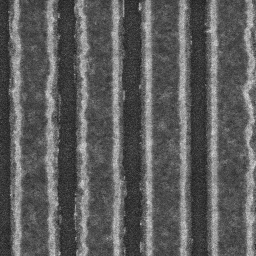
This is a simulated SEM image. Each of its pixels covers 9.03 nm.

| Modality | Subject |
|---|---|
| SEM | one or a few lines or trenches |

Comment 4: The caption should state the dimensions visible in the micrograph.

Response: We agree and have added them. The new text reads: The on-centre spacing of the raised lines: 596 nm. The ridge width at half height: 309 nm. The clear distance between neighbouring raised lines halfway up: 286 nm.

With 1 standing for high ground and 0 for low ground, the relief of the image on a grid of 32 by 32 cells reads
00111100001111000001111000011110
00111100001111000001111000011110
00111100001111000001111000011110
00111100001111000001111000011110
00111100001111000001111000011110
00111100000111000001111000011110
00111100001111000011111000011110
00111110001111000011111000011110
00111100001111000011111000011110
00111110001111000011111000011110
00111100001111100001111000011110
00111100001111100001111000011110
00111100000111000001111000011110
00111100000111000001111000011110
00111100001111100001111000011111
00111100001111100001111000011110
00111100001111100001111000011110
00111100000111100001111000011110
00111100001111100001111000011110
00111100001111000001111000011110
00111100001111000001111000011111
00111100001111100001111000011110
00111100000111100001111000011110
00111100000111100001111000011110
00111100000111100001111000011110
00111110001111100001111000011110
00111100001111000001111000011110
00111100000111100001111000011110
00111100000111000001111000011110
00111100001111000001111000011110
00111110001111100001111000011110
00111110000111100001111000011110